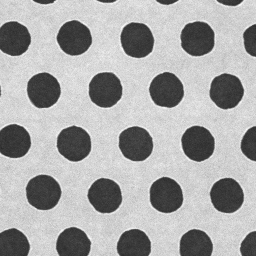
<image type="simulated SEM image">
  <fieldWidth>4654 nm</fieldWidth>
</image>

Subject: a regular array of holes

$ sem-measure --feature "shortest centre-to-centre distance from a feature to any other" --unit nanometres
1080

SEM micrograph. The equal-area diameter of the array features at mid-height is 0.641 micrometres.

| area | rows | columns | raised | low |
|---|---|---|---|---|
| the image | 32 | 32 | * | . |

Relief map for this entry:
*****.**************..******..**
********************************
********************************
...*****...****....****...*****.
....***....****....****....***..
....***....****....****....***..
...*****...*****...****...*****.
********************************
********************************
****...*****...*****..*****..***
***....****....****....***....**
***.....***....****....***....**
****...****....****....***....**
*****.*********************..***
********************************
********************************
...*****...****....****...*****.
....***....****....****....***..
....***....****....****....***..
*..*****...*****...****...*****.
********************************
********************************
****...*****..******..*****..***
***.....***....****....***....**
***.....***....****....***....**
****...****....****....****...**
************..******..******.***
********************************
********..**********************
...****....****...*****...*****.
....***....****....***.....***..
....***....****....***.....***..